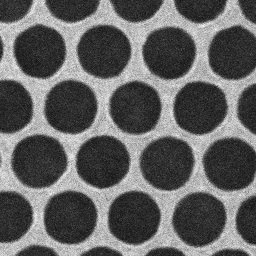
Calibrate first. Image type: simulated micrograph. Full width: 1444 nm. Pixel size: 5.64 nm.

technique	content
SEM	a regular array of holes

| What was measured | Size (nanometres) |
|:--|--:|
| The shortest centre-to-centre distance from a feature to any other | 357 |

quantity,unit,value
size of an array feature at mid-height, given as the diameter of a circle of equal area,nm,306